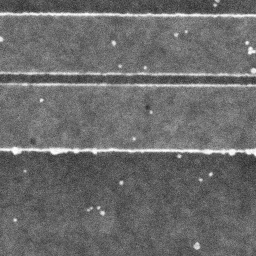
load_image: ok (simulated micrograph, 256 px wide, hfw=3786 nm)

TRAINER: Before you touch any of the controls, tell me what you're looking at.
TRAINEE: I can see lines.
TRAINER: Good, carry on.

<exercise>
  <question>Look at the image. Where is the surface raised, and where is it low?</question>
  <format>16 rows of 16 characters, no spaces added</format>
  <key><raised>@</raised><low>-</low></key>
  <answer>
----------------
@@@@@@@@@@@@@@@@
@@@@@@@@@@@@@@@@
@@@@@@@@@@@@@@@@
@@@@@@@@@@@@@@@@
@@@@@@@@@@@@@@@@
@@@@@@@@@@@@@@@@
@@@@@@@@@@@@@@@@
@@@@@@@@@@@@@@@@
---@---------@@@
----------------
----------------
----------------
----------------
----------------
----------------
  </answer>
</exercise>